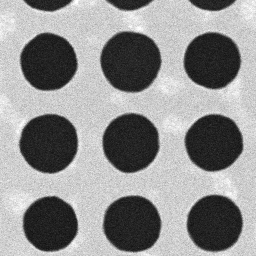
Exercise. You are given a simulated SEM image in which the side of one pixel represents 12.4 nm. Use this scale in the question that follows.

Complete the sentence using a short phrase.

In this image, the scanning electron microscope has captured a regular array of holes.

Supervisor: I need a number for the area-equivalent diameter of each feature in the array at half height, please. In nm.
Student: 719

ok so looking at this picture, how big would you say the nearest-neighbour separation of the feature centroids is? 1010 nanometres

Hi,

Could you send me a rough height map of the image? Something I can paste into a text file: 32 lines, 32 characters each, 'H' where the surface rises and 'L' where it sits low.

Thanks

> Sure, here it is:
HHHLLLLLLHHHHHLLLLLHHHHHLLLLLHHH
HHHHHHHHHHHHHHHHHHHHHHHHHHHHHHHH
HHHHHHHHHHHHHHHHHHHHHHHHHHHHHHHH
HHHHHHHHHHHHHHHHHHHHHHHHHHHHHHHH
HHHHLLLLHHHHHHLLLLHHHHHHHLLLHHHH
HHHLLLLLLHHHHLLLLLLLHHHHLLLLLLHH
HHHLLLLLLHHHHLLLLLLLHHHLLLLLLLHH
HHLLLLLLLLHHLLLLLLLLHHHLLLLLLLHH
HHHLLLLLLLHHHLLLLLLLHHHLLLLLLLHH
HHHLLLLLLHHHHLLLLLLLHHHHLLLLLLHH
HHHHLLLLHHHHHHLLLLLHHHHHHLLLLHHH
HHHHHHHHHHHHHHHHLHHHHHHHHHHHHHHH
HHHHHHHHHHHHHHHHHHHHHHHHHHHHHHHH
HHHHHHHHHHHHHHHHHHHHHHHHHHHHHHHH
HHHHHLLLHHHHHHHLLLHHHHHHHLLLHHHH
HHHLLLLLLHHHHHLLLLLHHHHHLLLLLLHH
HHHLLLLLLLHHHLLLLLLLHHHLLLLLLLHH
HHLLLLLLLLHHHLLLLLLLHHHLLLLLLLHH
HHLLLLLLLLHHHLLLLLLLHHHLLLLLLLHH
HHHLLLLLLHHHHLLLLLLLHHHHLLLLLLHH
HHHLLLLLLHHHHHLLLLLHHHHHLLLLLHHH
HHHHHLLHHHHHHHHLLHHHHHHHHHHHHHHH
HHHHHHHHHHHHHHHHHHHHHHHHHHHHHHHH
HHHHHHHHHHHHHHHHHHHHHHHHHHHHHHHH
HHHHHHLHHHHHHHHHLHHHHHHHHHLLHHHH
HHHHLLLLLHHHHHLLLLLHHHHHLLLLLHHH
HHHLLLLLLHHHHLLLLLLLHHHHLLLLLLHH
HHHLLLLLLLHHHLLLLLLLHHHLLLLLLLHH
HHHLLLLLLLHHHLLLLLLLHHHLLLLLLLHH
HHHLLLLLLHHHHLLLLLLLHHHHLLLLLLHH
HHHHLLLLLHHHHHLLLLLHHHHHLLLLLHHH
HHHHHHHHHHHHHHHHLHHHHHHHHHHHHHHH